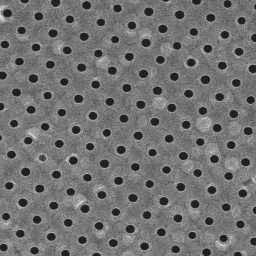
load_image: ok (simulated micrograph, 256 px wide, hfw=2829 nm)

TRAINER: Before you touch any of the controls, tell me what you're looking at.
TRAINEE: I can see a regular array of holes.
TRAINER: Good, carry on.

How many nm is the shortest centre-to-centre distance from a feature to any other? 240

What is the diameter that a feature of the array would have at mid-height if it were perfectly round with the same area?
91.6 nanometers